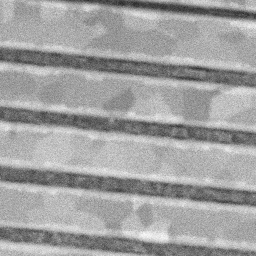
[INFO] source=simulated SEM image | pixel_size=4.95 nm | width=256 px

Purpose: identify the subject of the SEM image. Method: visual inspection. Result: parallel lines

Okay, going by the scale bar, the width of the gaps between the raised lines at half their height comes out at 18.2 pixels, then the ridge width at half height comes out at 202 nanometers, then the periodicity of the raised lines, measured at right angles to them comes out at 298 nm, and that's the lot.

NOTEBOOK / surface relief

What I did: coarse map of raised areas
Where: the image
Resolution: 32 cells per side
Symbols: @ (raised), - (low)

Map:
@@@@@@@@@@--------------@@@@@@@@
@@@@@@@@@@@@@@@@@@@@------------
@@@@@@@@@@@@@@@@@@@@@@@@@@@@@@--
@@@@@@@@@@@@@@@@@@@@@@@@@@@@@@@@
@@@@@@@@@@@@@@@@@@@@@@@@@@@@@@@@
@@@@@@@@@@@@@@@@@@@@@@@@@@@@@@@@
---------@@@@@@@@@@@@@@@@@@@@@@@
-------------------@@@@@@@@@@@@@
@@@@@-----------------------@@@@
@@@@@@@@@@@@@@@-----------------
@@@@@@@@@@@@@@@@@@@@@@@@@-------
@@@@@@@@@@@@@@@@@@@@@@@@@@@@@@@@
@@@@@@@@@@@@@@@@@@@@@@@@@@@@@@@@
-----@@@@@@@@@@@@@@@@@@@@@@@@@@@
--------------@@@@@@@@@@@@@@@@@@
@-----------------------@@@@@@@@
@@@@@@@@@@@---------------------
@@@@@@@@@@@@@@@@@@@@@-----------
@@@@@@@@@@@@@@@@@@@@@@@@@@@@@@@-
@@@@@@@@@@@@@@@@@@@@@@@@@@@@@@@@
@@@@@@@@@@@@@@@@@@@@@@@@@@@@@@@@
----------@@@@@@@@@@@@@@@@@@@@@@
--------------------@@@@@@@@@@@@
@@@@@@------------------------@@
@@@@@@@@@@@@@@@@@---------------
@@@@@@@@@@@@@@@@@@@@@@@@@@------
@@@@@@@@@@@@@@@@@@@@@@@@@@@@@@@@
@@@@@@@@@@@@@@@@@@@@@@@@@@@@@@@@
-----@@@@@@@@@@@@@@@@@@@@@@@@@@@
---------------@@@@@@@@@@@@@@@@@
@@-----------------------@@@@@@@
@@@@@@@@@@@@--------------------